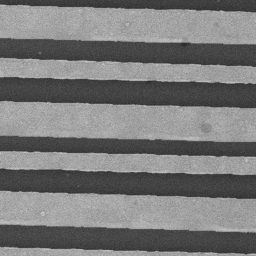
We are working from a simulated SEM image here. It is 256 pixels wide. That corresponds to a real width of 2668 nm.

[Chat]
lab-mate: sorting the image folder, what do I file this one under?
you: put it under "lines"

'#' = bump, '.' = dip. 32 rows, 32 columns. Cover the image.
................................
############################....
################################
################################
...........#####################
................................
................................
#####...........................
################################
################################
................................
................................
................................
###########################.....
################################
################################
...#############################
................................
................................
#####################...........
################################
..................##############
................................
................................
################................
################################
################################
################################
...........................#####
................................
................................
##################..............